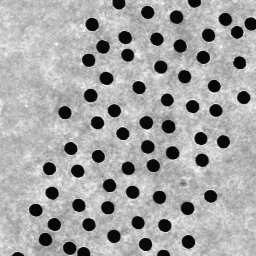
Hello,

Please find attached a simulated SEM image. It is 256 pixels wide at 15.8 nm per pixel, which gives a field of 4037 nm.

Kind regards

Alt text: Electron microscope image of a regular array of holes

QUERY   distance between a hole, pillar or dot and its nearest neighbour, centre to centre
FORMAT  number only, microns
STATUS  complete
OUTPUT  0.37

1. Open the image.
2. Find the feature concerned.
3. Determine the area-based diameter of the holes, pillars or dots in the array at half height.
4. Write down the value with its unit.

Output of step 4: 207 nanometers